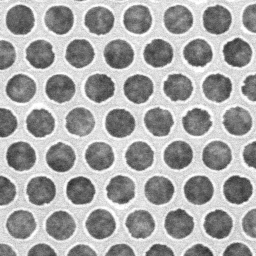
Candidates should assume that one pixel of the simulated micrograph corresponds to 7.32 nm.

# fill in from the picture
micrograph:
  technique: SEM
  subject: a regular array of holes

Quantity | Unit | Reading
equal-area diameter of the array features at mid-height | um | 0.224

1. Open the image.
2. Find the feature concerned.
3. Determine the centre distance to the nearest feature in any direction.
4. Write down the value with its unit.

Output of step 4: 38.6 pixels